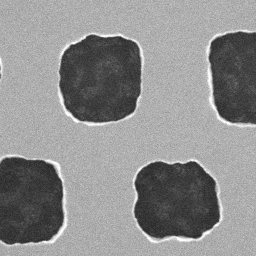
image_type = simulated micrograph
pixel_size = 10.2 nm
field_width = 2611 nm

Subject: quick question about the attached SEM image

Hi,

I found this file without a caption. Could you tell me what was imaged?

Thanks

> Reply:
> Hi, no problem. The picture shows holes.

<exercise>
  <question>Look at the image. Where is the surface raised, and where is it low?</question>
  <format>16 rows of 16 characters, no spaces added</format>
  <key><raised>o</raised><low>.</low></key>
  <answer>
oooooooooooooooo
oooooooooooooooo
ooooo...ooooo...
oooo.....oooo...
oooo.....oooo...
oooo.....oooo...
oooo.....oooo...
ooooo..ooooooo..
oooooooooooooooo
oooooooooooooooo
...oooooo....ooo
....oooo......oo
....ooooo.....oo
....oooo......oo
....ooooo....ooo
oooooooooooooooo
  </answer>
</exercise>